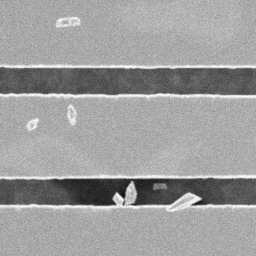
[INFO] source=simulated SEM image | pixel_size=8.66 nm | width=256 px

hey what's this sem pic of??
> lines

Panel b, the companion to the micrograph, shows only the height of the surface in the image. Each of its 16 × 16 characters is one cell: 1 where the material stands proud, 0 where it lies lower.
1111111111111111
1111111111111111
1111111111111111
1111111111111111
0000000000000000
0000000000000000
1111111111111111
1111111111111111
1111111111111111
1111111111111111
1111111111111111
0000000000000000
0000000100010000
1111111111111111
1111111111111111
1111111111111111